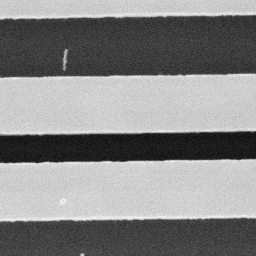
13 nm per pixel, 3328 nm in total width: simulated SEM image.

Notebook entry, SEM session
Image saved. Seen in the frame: lines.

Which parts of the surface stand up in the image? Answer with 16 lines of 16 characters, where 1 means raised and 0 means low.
1111111111111111
0000000000000000
0000000000000000
0000000000000000
0000000000000000
1111111111111111
1111111111111111
1111111111111111
0000000000000000
0000000000000000
1111111111111111
1111111111111111
1111111111111111
1111111111111111
0000000000000000
0000000000000000